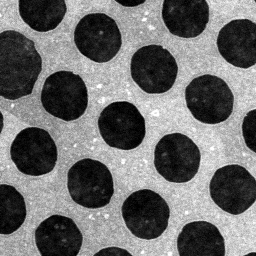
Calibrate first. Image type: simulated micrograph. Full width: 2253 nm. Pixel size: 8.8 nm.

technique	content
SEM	a regular array of holes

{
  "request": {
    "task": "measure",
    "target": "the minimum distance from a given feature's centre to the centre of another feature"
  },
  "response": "562 nm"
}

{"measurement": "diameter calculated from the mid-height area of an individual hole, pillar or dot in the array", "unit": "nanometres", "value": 430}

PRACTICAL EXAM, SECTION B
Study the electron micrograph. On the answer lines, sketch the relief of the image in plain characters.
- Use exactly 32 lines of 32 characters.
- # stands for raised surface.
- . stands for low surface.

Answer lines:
##......#######...##......######
##......############......######
###.....##....######......###..#
####...##......######.....##....
...######......#######...##.....
....#####......############.....
.....#####.....##....######.....
.....######...##......######....
.....###########......########.#
.....#....######......###..#####
....#......######.....##....####
....#......#######...##......###
#####......############......###
#####......##....######......###
#######...##......######.....##.
############......########.###..
##....######......############..
##.....######.....##....#######.
#......#######...##......######.
#......############......#######
##.....##....######......#######
###...###.....######.....##....#
########......#######...##......
..#######.....############......
...######.....##....######......
...#######...##......######.....
...############......#######..##
...###...######......###########
..###.....######.....##....#####
####......#######...##......####
####......############......####
#####.....##....######......####